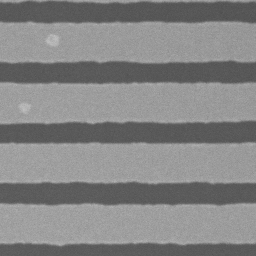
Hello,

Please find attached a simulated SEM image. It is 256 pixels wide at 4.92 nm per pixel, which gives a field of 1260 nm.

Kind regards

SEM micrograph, lines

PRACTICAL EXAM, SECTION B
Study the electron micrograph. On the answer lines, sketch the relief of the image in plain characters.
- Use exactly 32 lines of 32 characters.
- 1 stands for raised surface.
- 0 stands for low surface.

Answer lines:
00000000000000000000000000000000
00000000000000000000000000000000
00000000000000000000000000000000
11111111111111111111111111111111
11111111111111111111111111111111
11111111111111111111111111111111
11111111111111111111111111111111
11111111111111111111111111111111
00000000000000000000000000000000
00000000000000000000000000000000
11000011000001001111111111110011
11111111111111111111111111111111
11111111111111111111111111111111
11111111111111111111111111111111
11111111111111111111111111111111
00000000000000000000000000000000
00000000000000000000000000000000
00000000000000000000000000000000
11111111111111111111111111111111
11111111111111111111111111111111
11111111111111111111111111111111
11111111111111111111111111111111
11111111111111111111111111111111
00000000000000000000000000000000
00000000000000000000000000000000
00000000000000000000000000000000
11111111111111111111111111111111
11111111111111111111111111111111
11111111111111111111111111111111
11111111111111111111111111111111
00000011100000000000001100000000
00000000000000000000000000000000